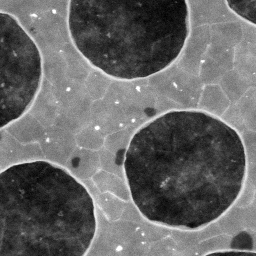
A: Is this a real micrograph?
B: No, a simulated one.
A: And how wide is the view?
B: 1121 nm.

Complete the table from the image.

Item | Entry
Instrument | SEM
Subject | holes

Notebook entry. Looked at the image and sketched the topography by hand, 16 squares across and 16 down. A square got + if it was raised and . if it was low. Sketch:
++++........++..
.+++........++++
..+++.......++++
..+++......+++++
...++++...++++++
..++++++++++++++
..++++++++++++++
.+++++++++....++
++++++++.......+
++++++++.......+
+...++++.......+
.....+++.......+
......++.......+
......+++.....++
......++++++++++
.....+++++++++++